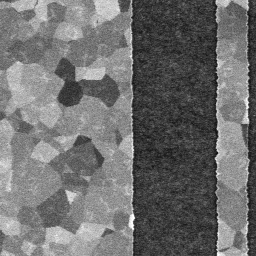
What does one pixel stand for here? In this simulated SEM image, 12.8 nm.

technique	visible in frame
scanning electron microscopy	one or a few lines or trenches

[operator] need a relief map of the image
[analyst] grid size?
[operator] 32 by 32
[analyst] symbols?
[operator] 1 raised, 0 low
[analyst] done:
11111111111111110000000000011110
11111111111111110000000000011110
11111111111111110000000000011110
11111111111111110000000000011110
11111111111111110000000000011110
11111111111111110000000000011110
11111111111111110000000000011110
11111111111111110000000000011110
11111111111111110000000000011110
11111111111111110000000000011110
11111111111111110000000000011110
11111111111111110000000000011110
11111111111111111000000000011110
11111111111111110000000000011110
11111111111111110000000000011110
11111111111111111000000000011110
11111111111111111000000000011110
11111111111111111000000000011110
11111111111111111000000000011110
11111111111111111000000000011110
11111111111111110000000000011110
11111111111111110000000000011110
11111111111111111000000000011110
11111111111111111000000000011110
11111111111111111000000000011110
11111111111111111000000000011110
11111111111111111000000000011110
11111111111111111000000000011110
11111111111111111000000000011110
11111111111111111000000000011110
11111111111111111000000000011110
11111111111111111000000000011110